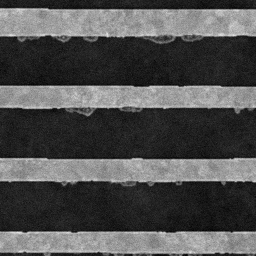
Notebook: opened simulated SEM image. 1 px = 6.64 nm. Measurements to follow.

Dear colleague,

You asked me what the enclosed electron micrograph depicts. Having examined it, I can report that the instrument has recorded lines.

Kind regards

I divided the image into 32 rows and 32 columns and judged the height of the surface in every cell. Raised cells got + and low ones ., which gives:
................................
++++++++++++++++++++++++++++++++
++++++++++++++++++++++++++++++++
++++++++++++++++++++++++++++++++
..+....++.++.......+++.++.......
................................
................................
................................
................................
................................
................................
++++++++++++++++++++++++++++++++
++++++++++++++++++++++++++++++++
...++...++++....+............+..
................................
................................
................................
................................
................................
................................
++++++++++++++++++++++++++++++++
++++++++++++++++++++++++++++++++
++++.++++++.++++++++++++++++++++
................................
................................
................................
................................
................................
................................
++++++++++++++++++++++++++++++++
++++++++++++++++++++++++++++++++
++++.+++++++.+++++++++++++++++++